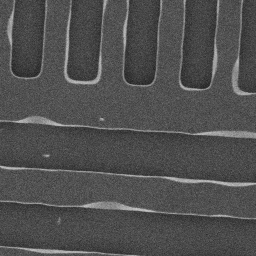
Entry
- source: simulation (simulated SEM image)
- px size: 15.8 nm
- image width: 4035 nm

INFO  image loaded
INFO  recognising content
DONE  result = groups of lines, slits or small figures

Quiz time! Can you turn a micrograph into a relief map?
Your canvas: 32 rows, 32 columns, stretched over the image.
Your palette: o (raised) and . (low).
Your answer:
oo....ooo....ooo....ooo....ooo..
oo....ooo....ooo....ooo....ooo..
o.....ooo....ooo....ooo....ooo..
o.....ooo....ooo....ooo....ooo..
o....ooo.....ooo....ooo....ooo..
o....ooo.....ooo....ooo....ooo..
o....ooo.....ooo....ooo....ooo..
o....ooo.....oo.....ooo....ooo..
o....ooo.....oo.....ooo....ooo..
oo...ooo....oooo...oooo....oo...
ooooooooooooooooo..oooo...ooo...
oooooooooooooooooooooooooooooo..
oooooooooooooooooooooooooooooooo
oooooooooooooooooooooooooooooooo
oooooooooooooooooooooooooooooooo
.......ooooooooooooooooooooooooo
......................oooooooooo
................................
................................
................................
................................
oooooooooooo....................
ooooooooooooooooooooooo.........
oooooooooooooooooooooooooooooooo
oooooooooooooooooooooooooooooooo
.....ooooooooooooooooooooooooooo
...................ooooooooooooo
................................
................................
................................
................................
ooooooo.........................